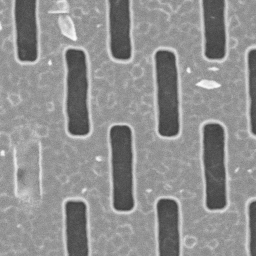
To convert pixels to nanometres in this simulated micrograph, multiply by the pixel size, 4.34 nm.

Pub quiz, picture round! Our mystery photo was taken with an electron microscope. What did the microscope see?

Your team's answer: holes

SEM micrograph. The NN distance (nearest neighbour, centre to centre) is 376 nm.